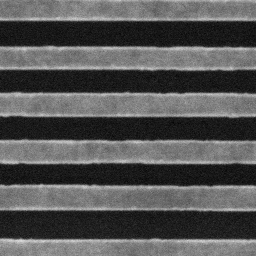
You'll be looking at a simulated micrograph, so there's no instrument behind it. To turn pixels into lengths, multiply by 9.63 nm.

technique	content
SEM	lines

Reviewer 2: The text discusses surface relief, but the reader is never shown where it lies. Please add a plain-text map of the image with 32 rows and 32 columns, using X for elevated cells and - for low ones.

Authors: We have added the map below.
XXXXXXXXXXXXXXXXXXXXXXXXXXXXXXXX
XXXXXXXXXXXXXXXXXXXXXXXXXXXXXXXX
XXXXXXXXXXXXXXXXXXXXXXXXXXXXXXXX
--------------------------------
--------------------------------
--------------------------------
XXXXXXXXXXXXXXXXXXXXXXXXXXXXXXXX
XXXXXXXXXXXXXXXXXXXXXXXXXXXXXXXX
XXXXXXXXXXXXXXXXXXXXXXXXXXXXXXXX
--------------------------------
--------------------------------
--------------------------------
XXXXXXXXXXXXXXXXXXXXXXXXXXXXXXXX
XXXXXXXXXXXXXXXXXXXXXXXXXXXXXXXX
---XXXXXXXXXXXXXXXXXXXXXXXXXXXXX
--------------------------------
--------------------------------
--------------------------------
XXXXXXXXXXXXXXXXXXXXXXXXXXXXXXXX
XXXXXXXXXXXXXXXXXXXXXXXXXXXXXXXX
--------------------------------
--------------------------------
--------------------------------
XXXXXXXXXXXXXXXXXXXXXXXXXXXXXXXX
XXXXXXXXXXXXXXXXXXXXXXXXXXXXXXXX
XXXXXXXXXXXXXXXXXXXXXXXXXXXXXXXX
--------------------------------
--------------------------------
--------------------------------
--------------------------------
XXXXXXXXXXXXXXXXXXXXXXXXXXXXXXXX
XXXXXXXXXXXXXXXXXXXXXXXXXXXXXXXX